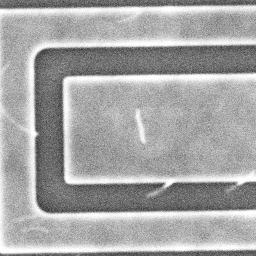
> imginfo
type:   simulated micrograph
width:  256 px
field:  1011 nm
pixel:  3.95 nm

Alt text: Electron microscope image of groups of lines, slits or small figures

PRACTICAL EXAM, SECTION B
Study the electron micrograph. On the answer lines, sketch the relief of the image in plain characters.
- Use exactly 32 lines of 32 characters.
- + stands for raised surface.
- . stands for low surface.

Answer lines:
................................
++++++++++++++++++++++++++++++++
++++++++++++++++++++++++++++++++
++++++++++++++++++++++++++++++++
++++++++++++++++++++++++++++++++
++++++++++++++++++++++++++++....
+++++...........................
++++............................
++++............................
++++..............++++++++++++++
++++....++++++++++++++++++++++++
++++....++++++++++++++++++++++++
++++....++++++++++++++++++++++++
++++....++++++++++++++++++++++++
++++....++++++++++++++++++++++++
++++....++++++++++++++++++++++++
++++....++++++++++++++++++++++++
++++....++++++++++++++++++++++++
++++....++++++++++++++++++++++++
++++....++++++++++++++++++++++++
++++....++++++++++++++++++++++++
++++....++++++++++++++++++++++++
++++....++++++++++++++++++++++++
++++............................
++++............................
+++++...........................
++++++..................++++++++
++++++++++++++++++++++++++++++++
++++++++++++++++++++++++++++++++
++++++++++++++++++++++++++++++++
++++++++++++++++++++++++++++++++
+++.............................